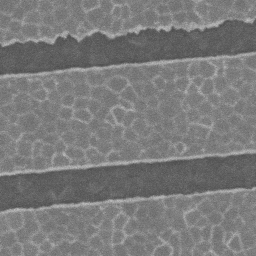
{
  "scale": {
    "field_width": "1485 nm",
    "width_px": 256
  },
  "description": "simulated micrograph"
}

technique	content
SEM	one or a few lines or trenches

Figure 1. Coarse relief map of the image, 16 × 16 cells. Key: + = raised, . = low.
++++++++++++++++
++++++++++++++..
+++.............
...............+
...+++++++++++++
++++++++++++++++
++++++++++++++++
++++++++++++++++
++++++++++++++++
++++++++++++++++
++++............
................
........++++++++
++++++++++++++++
++++++++++++++++
++++++++++++++++